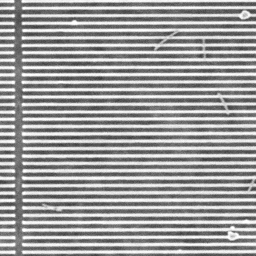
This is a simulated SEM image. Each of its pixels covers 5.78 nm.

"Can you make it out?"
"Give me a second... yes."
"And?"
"parallel lines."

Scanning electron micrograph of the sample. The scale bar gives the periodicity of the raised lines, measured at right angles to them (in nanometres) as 42.7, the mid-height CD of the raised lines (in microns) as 0.0145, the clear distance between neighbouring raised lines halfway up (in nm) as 29.6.